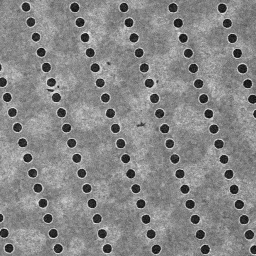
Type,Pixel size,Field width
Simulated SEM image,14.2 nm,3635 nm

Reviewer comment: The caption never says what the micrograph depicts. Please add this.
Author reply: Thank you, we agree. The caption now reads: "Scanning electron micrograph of a regular array of holes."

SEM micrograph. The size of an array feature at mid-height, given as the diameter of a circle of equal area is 9.71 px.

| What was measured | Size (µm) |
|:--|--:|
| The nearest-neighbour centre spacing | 0.225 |